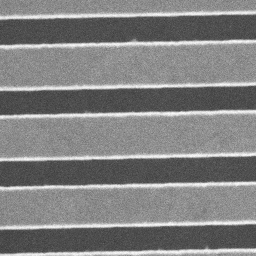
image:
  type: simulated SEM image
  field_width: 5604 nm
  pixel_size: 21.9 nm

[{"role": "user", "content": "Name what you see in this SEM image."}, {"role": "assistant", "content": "lines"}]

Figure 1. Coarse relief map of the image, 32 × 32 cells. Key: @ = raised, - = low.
@@@@@@@@@@@@@@@@@@@@@@@@@@@@@@@@
@@@@@@@@@@@@@@@@@@@@@@@@@@@@@@@@
--------------------------------
--------------------------------
--------------------------------
-----@@@@@@@@@@@@@@@@@@@@@@@@@@@
@@@@@@@@@@@@@@@@@@@@@@@@@@@@@@@@
@@@@@@@@@@@@@@@@@@@@@@@@@@@@@@@@
@@@@@@@@@@@@@@@@@@@@@@@@@@@@@@@@
@@@@@@@@@@@@@@@@@@@@@@@@@@@@@@@@
@@@@@@@@@@@@@@@@@@@@@@@@@@@@@@@@
--------------------------------
--------------------------------
--------------------------------
@@@@@@@@@@@@@@@@@@@@@@@@@@@@@@@@
@@@@@@@@@@@@@@@@@@@@@@@@@@@@@@@@
@@@@@@@@@@@@@@@@@@@@@@@@@@@@@@@@
@@@@@@@@@@@@@@@@@@@@@@@@@@@@@@@@
@@@@@@@@@@@@@@@@@@@@@@@@@@@@@@@@
@@@@@@@@@@@@@@@@@@@@@@@@@@@@@@@@
--------------------------------
--------------------------------
--------------------------------
@@@@@@@@@@@@@@@@@@@@@@@@@@@@@@@@
@@@@@@@@@@@@@@@@@@@@@@@@@@@@@@@@
@@@@@@@@@@@@@@@@@@@@@@@@@@@@@@@@
@@@@@@@@@@@@@@@@@@@@@@@@@@@@@@@@
@@@@@@@@@@@@@@@@@@@@@@@@@@@@@@@@
@@@@----------------------------
--------------------------------
--------------------------------
-----------@@@@@@@@@@@@@@@@@@@@@